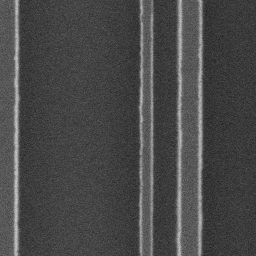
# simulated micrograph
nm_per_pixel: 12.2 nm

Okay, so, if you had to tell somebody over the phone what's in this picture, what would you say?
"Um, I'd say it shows lines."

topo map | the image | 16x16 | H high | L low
HLLLLLLLLHHHLLLL
HLLLLLLLLHHHLLLL
HLLLLLLLLHHHLLLL
HLLLLLLLLHHHLLLL
HLLLLLLLLHHHLLLL
HLLLLLLLLHHHLLLL
HLLLLLLLLHHHLLLL
HLLLLLLLLHHHLLLL
HLLLLLLLLHHHLLLL
HLLLLLLLLHHHLLLL
HLLLLLLLLHHHLLLL
HLLLLLLLLHHHLLLL
HLLLLLLLLHHHLLLL
HLLLLLLLLHHHLLLL
HLLLLLLLLHHHLLLL
HLLLLLLLLHHHLLLL